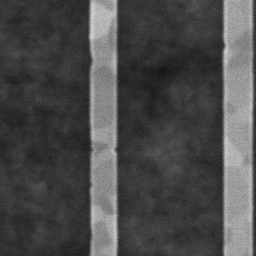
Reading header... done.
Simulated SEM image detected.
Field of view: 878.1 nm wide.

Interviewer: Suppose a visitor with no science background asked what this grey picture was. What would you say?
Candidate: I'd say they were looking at one or a few lines or trenches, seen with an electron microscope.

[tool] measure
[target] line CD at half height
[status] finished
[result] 25.5 pixels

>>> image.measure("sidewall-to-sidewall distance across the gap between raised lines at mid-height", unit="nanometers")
376